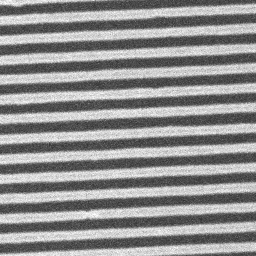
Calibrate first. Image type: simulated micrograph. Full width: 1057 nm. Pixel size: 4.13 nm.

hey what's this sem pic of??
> parallel lines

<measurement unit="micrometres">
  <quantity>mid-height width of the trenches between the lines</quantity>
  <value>0.0474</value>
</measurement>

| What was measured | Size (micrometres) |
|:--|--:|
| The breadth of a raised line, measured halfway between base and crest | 0.0335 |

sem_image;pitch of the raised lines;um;0.0818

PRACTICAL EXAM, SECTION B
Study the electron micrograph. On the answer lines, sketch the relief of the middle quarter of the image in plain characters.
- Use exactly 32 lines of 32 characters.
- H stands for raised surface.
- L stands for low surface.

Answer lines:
LLLLLLLLLLLLLLLLLLLLLLLLLLLLLLLL
LLLLLLLLLLLLLLLLHHHHHHHHHHHHHHHH
HHHHHHHHHHHHHHHHHHHHHHHHHHHHHHHH
HHHHHHHHHHHHHHHHLLLLLLLLLLLLLLLL
LLLLLLLLLLLLLLLLLLLLLLLLLLLLLLLL
LLLLLLLLLLLLLLLLLLLLLLLLLLLLLLLL
LLLLLLLLLLLLLLLLLHHHHHHHHHHHHHHH
HHHHHHHHHHHHHHHHHHHHHHHHHHHHHHHH
HHHHHHHHHHHHHHLLLLLLLLLLLLLLLLLL
LLLLLLLLLLLLLLLLLLLLLLLLLLLLLLLL
LLLLLLLLLLLLLLLLLLLLLLLLLLLLLLLL
LLLLLLLLLLLLLHHLHHHHHHHHHHHHHHHH
HHHHHHHHHHHHHHHHHHHHHHHHHHHHHHHH
HHHHHHHHHHHHLLLLLLLLLLLLLLLLLLLL
LLLLLLLLLLLLLLLLLLLLLLLLLLLLLLLL
LLLLLLLLLLLLLLLLLLLLLLLLLLLLLLLL
LLLLLLLLLLLLLLHHHHHHHHHHHHHHHHHH
HHHHHHHHHHHHHHHHHHHHHHHHHHHHHHHH
HHHHHHHHHHHHHHLLLLLLLLLLLLLLLLLL
LLLLLLLLLLLLLLLLLLLLLLLLLLLLLLLL
LLLLLLLLLLLLLLLLLLLLLLLLLLLLLLLL
LLLLLLLLLLLLLLLHHHHHHHHHHHHHHHHH
HHHHHHHHHHHHHHHHHHHHHHHHHHHHHHHH
HHHHHHHHHHHHLLLLLLLLLLLLLLLLLLLL
LLLLLLLLLLLLLLLLLLLLLLLLLLLLLLLL
LLLLLLLLLLLLLLLLLLLLLLLLLLLLLLLL
LLLLLLLLLLLLLLHHHHHHHHHHHHHHHHHH
HHHHHHHHHHHHHHHHHHHHHHHHHHHHHHHL
HHHHHHHHHHHHLLLLLLLLLLLLLLLLLLLL
LLLLLLLLLLLLLLLLLLLLLLLLLLLLLLLL
LLLLLLLLLLLLLLLLLLLLLLLLLLLLLLLL
LLLLLLLLLLLLHHHHHHHHHHHHHHHHHHHH